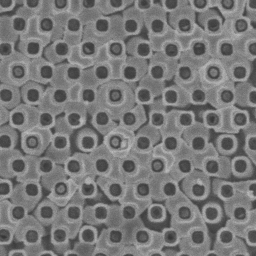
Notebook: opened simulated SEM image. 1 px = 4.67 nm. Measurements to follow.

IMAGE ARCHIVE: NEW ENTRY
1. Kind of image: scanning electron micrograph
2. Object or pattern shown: a regular array of holes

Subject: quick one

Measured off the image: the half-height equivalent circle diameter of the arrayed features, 61.5 nm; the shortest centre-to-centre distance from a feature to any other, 0.122 µm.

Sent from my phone